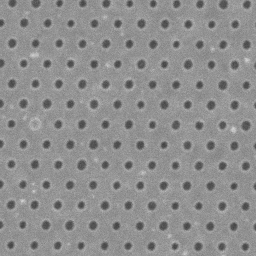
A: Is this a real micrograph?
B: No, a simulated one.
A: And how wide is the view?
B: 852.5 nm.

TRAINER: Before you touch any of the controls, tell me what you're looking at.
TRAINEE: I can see a regular array of holes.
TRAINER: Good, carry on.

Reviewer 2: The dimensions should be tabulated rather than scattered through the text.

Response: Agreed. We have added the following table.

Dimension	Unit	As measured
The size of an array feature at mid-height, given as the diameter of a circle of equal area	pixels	9.16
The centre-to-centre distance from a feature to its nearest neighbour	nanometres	76.8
